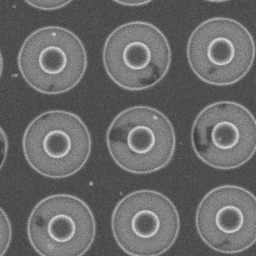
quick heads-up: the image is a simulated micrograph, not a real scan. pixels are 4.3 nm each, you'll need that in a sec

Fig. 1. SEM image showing an array of small figures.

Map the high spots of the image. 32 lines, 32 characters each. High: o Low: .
oooo....oooooooo.ooooooooooooooo
oooooooooooooooooooooooooooooooo
ooooooooooooooooooooooooooo.oooo
oooooo.oooooooo....oooooo.....oo
oooo.....ooooo......oooo.......o
ooo.......ooo...oo...ooo..ooo...
ooo..ooo..ooo...ooo..ooo..ooo...
oo...ooo...oo...ooo..ooo..ooo...
ooo..ooo...oo....o...ooo.......o
ooo.......oooo......ooooo.....oo
oooo.....oooooo....ooooooooooooo
oooooo.ooooooooooooooooooooooooo
oooooooooooooooooooooooooooooooo
ooooooooooooooooo.oooooooo....oo
ooooo....oooooo.....ooooo......o
oooo......oooo.......ooo...oo...
ooo....o...ooo..ooo...oo...ooo..
.oo...ooo..ooo..ooo...oo...ooo..
.oo...ooo..ooo..ooo...oo........
.oo...oo...ooo.......oooo......o
oooo......ooooo......ooooo....oo
ooooo....oooooooo.oooooooooooooo
oooooooooooooooooooooooooooooooo
oooooooooooooooooooooooooooo..oo
ooooooo.oooooooo....oooooo.....o
ooooo.....ooooo......oooo.......
oooo.......ooo....o...ooo..ooo..
.ooo..ooo...oo...ooo..ooo..ooo..
.ooo..ooo...oo...ooo..ooo...oo..
.ooo..ooo...oo....o...ooo.......
.ooo.......oooo......ooooo.....o
ooooo.....oooooo....oooooooooooo